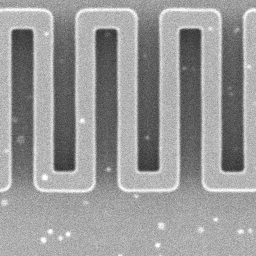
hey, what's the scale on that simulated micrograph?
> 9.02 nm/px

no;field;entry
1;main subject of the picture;groups of lines, slits or small figures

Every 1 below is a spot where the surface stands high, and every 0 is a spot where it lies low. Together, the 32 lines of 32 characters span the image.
00000000000000000000000000000000
11111100001111111000111111100001
11111110001111111000111111110001
11111110001110111000111001110001
10001110001100011000110001110001
10001110001100011000110001110001
10001110001100011000110001110001
10001110001100011000110001110001
10001110001100011000110001110001
10001110001100011000110001110001
10001110001100011000110001110001
10001110001100011000110001110001
10001110001100011000110001110001
10001110001100011000110001110001
10001110001100011000110001110001
10001110001100011000110001110001
10001110001100011000110001110001
10001110001100011000110001110001
10001110001100011000110001110001
10001110001100011000110001110001
10001110001100011000110001110001
10001110011100011101110001110011
10001111111100011111110001111111
10000111111000011111110000111111
00000000000000000000000000000000
00000000000000000000000000000000
00000000000000000000000000000000
00000000000000000000000000000000
00000000000000000000000000000000
00000000000000000000000000000000
00000000000000000000000000000000
00000000000000000000000000000000